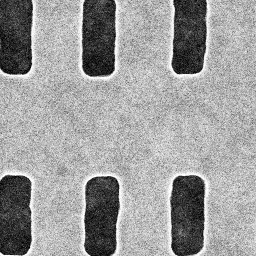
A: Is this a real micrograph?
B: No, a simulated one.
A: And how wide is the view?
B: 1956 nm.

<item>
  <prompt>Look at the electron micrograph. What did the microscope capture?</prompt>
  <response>holes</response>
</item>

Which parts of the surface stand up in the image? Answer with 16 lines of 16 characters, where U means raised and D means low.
DDUUUDDUUUUDDUUU
DDUUUDDUUUUDDUUU
DDUUUDDUUUUDDUUU
DDUUUDDUUUUDDUUU
DDUUUDDUUUUDUUUU
UUUUUUUUUUUUUUUU
UUUUUUUUUUUUUUUU
UUUUUUUUUUUUUUUU
UUUUUUUUUUUUUUUU
UUUUUUUUUUUUUUUU
UUUUUUUUUUUUUUUU
DDUUUDDUUUUDDUUU
DDUUUDDUUUUDDUUU
DDUUUDDUUUUDDUUU
DDUUUDDUUUUDDUUU
DDUUUDDUUUUDDUUU